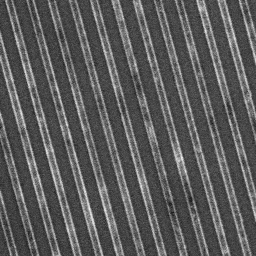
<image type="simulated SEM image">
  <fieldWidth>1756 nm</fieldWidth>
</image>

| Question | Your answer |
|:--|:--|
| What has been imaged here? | parallel lines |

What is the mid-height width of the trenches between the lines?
95.3 nm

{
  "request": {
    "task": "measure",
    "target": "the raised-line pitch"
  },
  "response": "141 nanometers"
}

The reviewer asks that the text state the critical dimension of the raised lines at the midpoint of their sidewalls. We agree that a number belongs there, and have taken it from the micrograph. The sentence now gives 6.88 px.